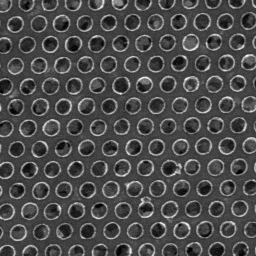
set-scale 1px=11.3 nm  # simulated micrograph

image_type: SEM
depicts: a regular array of raised bodies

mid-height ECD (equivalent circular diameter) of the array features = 182 nanometres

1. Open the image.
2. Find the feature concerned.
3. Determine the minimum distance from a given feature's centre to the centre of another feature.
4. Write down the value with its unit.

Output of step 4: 261 nm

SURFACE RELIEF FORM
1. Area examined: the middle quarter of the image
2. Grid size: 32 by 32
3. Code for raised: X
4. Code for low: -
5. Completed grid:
XX--XXX--XXXX--XXXX--XXXX--XXXX-
X---XXX---XX----XX----XX----X---
--------------------------------
-------------XX----------XX----X
-XXX---XXX--XXXX--XXXX--XXXX--XX
-XXX---XXX--XXXX--XXXX--XXXX--XX
-XXX---XXX--XXXX--XXX----XX----X
--------------------------------
-----------------X-----X--------
X---XXX---XXX---XXX---XXX---XXX-
XX--XXXX--XXX--XXXX--XXXX--XXXX-
X---XXX---XXX---XXX--XXXX--XXXX-
-----X--------------------------
--------------------------------
--XX---XXX---XXX---XXX---XXX--XX
-XXXX--XXX---XXX---XXX--XXXX--XX
-XXX---XXX---XXX---XXX--XXXX--XX
--XX---XX-----------X-----------
--------------------------------
X----XX----XX---XXX---XXX---XXX-
XX--XXXX--XXX---XXX--XXXX--XXXX-
XX--XXXX--XXX---XXX--XXXX--XXXX-
X---XXX---XXX---XXX---XX----XX--
--------------------------------
--XX----XX---XXX---XXX---XX----X
-XXXX--XXXX--XXX--XXXX---XXXX-XX
-XXXX--XXXX--XXX--XXXX---XXXX-XX
-XXX---XXX---XX----XX----XXX---X
--------------------------------
-----------XX----X-----XX----XX-
XX--XXXX--XXXX--XXX---XXX---XXX-
XX--XXXX--XXXX--XXX--XXXX---XXX-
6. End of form